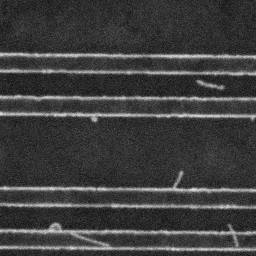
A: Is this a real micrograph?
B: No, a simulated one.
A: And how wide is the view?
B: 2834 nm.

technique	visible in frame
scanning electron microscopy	lines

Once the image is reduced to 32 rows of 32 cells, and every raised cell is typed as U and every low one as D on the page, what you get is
DDDDDDDDDDDDDDDDDDDDDDDDDDDDDDDD
DDDDDDDDDDDDDDDDDDDDDDDDDDDDDDDD
DDDDDDDDDDDDDDDDDDDDDDDDDDDDDDDD
DDDDDDDDDDDDDDDDDDDDDDDDDDDDDDDD
DDDDDDDDDDDDDDDDDDDDDDDDDDDDDDDD
DDDDDDDDDDDDDDDDDDDDDDDDDDDDDDDD
DDDDDDDDDDDDDDDDDDDDDDDDDDDDDDDD
UUUUUUUUUUUUUUUUUUUUUUUUUUUUUUUU
UUUUUUUUUUUUUUUUUUUUUUUUUUUUUUUU
DDDDDDDDDDDDDDDDDDDDDDDDDDDDDDDD
DDDDDDDDDDDDDDDDDDDDDDDDDDDDDDDD
DDDDDDDDDDDDDDDDDDDDDDDDDDDDDDDD
UUUUUUUUUUUUUUUUUUUUUUUUUUUUUUUU
UUUUUUUUUUUUUUUUUUUUUUUUUUUUUUUU
DDDDDDDDDDDDDDDDDDDUUUUUUUUUUUUU
DDDDDDDDDDDDDDDDDDDDDDDDDDDDDDDD
DDDDDDDDDDDDDDDDDDDDDDDDDDDDDDDD
DDDDDDDDDDDDDDDDDDDDDDDDDDDDDDDD
DDDDDDDDDDDDDDDDDDDDDDDDDDDDDDDD
DDDDDDDDDDDDDDDDDDDDDDDDDDDDDDDD
DDDDDDDDDDDDDDDDDDDDDDDDDDDDDDDD
DDDDDDDDDDDDDDDDDDDDDDDDDDDDDDDD
DDDDDDDDDDDDDDDDDDDDDDDDDDDDDDDD
UDDDDDDDDDDDDDDDDDDDDDDDDDDDDDDD
UUUUUUUUUUUUUUUUUUUUUUUUUUUUUUUU
UUUUUUUUUUUUUUUUUUUUUUUUUUUUUUUU
DDDDDDDDDDDDDDDDDDDDDDDDDDDDDDDD
DDDDDDDDDDDDDDDDDDDDDDDDDDDDDDDD
DDDDDDDDDDDDDDDDDDDDDDDDDDDDDDDD
UUUUUUUUUUUUUUUUUUUUUUUUUUUUUUUU
UUUUUUUUUUUUUUUUUUUUUUUUUUUUUUUU
DDDDDDDDDDDDDDDDDDDDDDDDDDDDDDDD